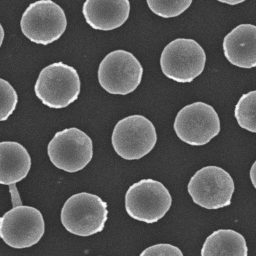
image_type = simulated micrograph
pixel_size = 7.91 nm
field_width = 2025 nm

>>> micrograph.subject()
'a regular array of raised bodies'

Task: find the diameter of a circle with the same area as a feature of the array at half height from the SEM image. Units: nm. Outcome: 348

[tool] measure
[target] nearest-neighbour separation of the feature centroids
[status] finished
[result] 510 nanometers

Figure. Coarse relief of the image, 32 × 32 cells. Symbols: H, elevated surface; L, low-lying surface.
LLLLHHHLLLLHHHHHLLLHHHHHLLLLLLLL
LLLHHHHHLLHHHHHHLLLHHHHLLLLLLLLL
LLLHHHHHLLLHHHHHLLLLLLLLLLLLLLLL
LLLHHHHHLLLLHHLLLLLLLLLLLLLLLHHH
LLLHHHHHLLLLLLLLLLLLLLLLLLLLHHHH
LLLLLHLLLLLLLLLLLLLLLHHHHLLLHHHH
LLLLLLLLLLLLLLHHLLLLHHHHHLLLHHHH
LLLLLLLLLLLLLHHHHLLLHHHHHHLLLHHH
LLLLLLHHHLLLHHHHHHLLHHHHHLLLLLLL
LLLLLHHHHHLLHHHHHHLLLHHHHLLLLLLL
HLLLLHHHHHLLLHHHHLLLLLLLLLLLLLLL
HHLLHHHHHHLLLLHHLLLLLLLLLLLLLLLH
HHLLLHHHHLLLLLLLLLLLLLLLLLLLLLHH
HHLLLLLLLLLLLLLLLLLLLLLHHHHLLHHH
HLLLLLLLLLLLLLLLHHLLLLHHHHHLLHHH
LLLLLLLLLLLLLLLHHHHLLLHHHHHLLLHH
LLLLLLLHHHLLLLHHHHHLLLHHHHHLLLLL
LLLLLLHHHHHLLLHHHHHLLLLHHHLLLLLL
HHHLLLHHHHHHLLHHHHHLLLLLLLLLLLLL
HHHHLLHHHHHLLLLHHHLLLLLLLLLLLLLL
HHHHLLLHHHHLLLLLLLLLLLLLLLLLLLLL
HHHLLLLLLLLLLLLLLLLLLLLLLHHHLLLH
HHLLLLLLLLLLLLLLLLHLLLLLHHHHHLLH
LHLLLLLLLLLLLLLLHHHHHLLLHHHHHLLL
LHLLLLLLLHHHLLLLHHHHHLLLHHHHHLLL
LLHLLLLLHHHHHLLLHHHHHLLLLHHHLLLL
LHHHHLLLHHHHHLLLHHHHHLLLLLLLLLLL
HHHHHLLLHHHHHLLLLHHHLLLLLLLLLLLL
HHHHHHLLHHHHHLLLLLLLLLLLLLLLLLLL
HHHHHLLLLLLLLLLLLLLLLLLLLLHHHHLL
LHHHLLLLLLLLLLLLLLLLLLLLLLHHHHHL
LLLLLLLLLLLLLLLLLLHHHHHLLHHHHHHL